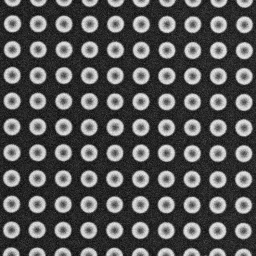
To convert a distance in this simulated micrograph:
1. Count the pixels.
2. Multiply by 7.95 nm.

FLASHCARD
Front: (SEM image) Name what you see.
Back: an array of small figures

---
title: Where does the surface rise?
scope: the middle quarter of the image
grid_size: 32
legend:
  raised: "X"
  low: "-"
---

--------------------------------
X----XXX---XXX----XXX---XXX----X
XX--XXXX---XXXX--XXXX---XXXX--XX
XX--XXXX---XXXX--XXXX---XXXX--XX
X----XXX----XX----XXX---XXX----X
--------------------------------
--------------------------------
X------------------X------------
XX---XXX---XXXX--XXXX---XXX---XX
XX--XXXX---XXXX--XXXX---XXXX--XX
XX---XXX---XXX----XXX---XXX---XX
--------------------------------
--------------------------------
--------------------------------
X----XXX---XXX----XXX---XXX----X
XX--XXXX---XXXX--XXXX---XXXX--XX
XX--XXXX---XXXX--XXXX---XXXX--XX
X----XX-----XX----XX----XXX----X
--------------------------------
--------------------------------
X----XX-----XX----XX-----X-----X
XX--XXXX---XXX---XXXX---XXX---XX
XX--XXXX---XXXX--XXXX---XXXX--XX
X----XXX---XXX----XXX---XXX---XX
--------------------------------
--------------------------------
--------------------------------
X----XXX---XXX----XXX---XXX----X
XX--XXXX---XXXX--XXXX---XXX---XX
XX---XXX---XXX---XXXX---XXX---XX
------X-----XX----XX-----XX----X
--------------------------------